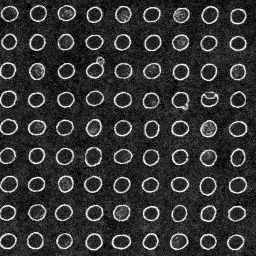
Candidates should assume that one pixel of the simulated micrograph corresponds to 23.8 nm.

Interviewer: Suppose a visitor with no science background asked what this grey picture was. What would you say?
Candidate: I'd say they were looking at a regular array of raised bodies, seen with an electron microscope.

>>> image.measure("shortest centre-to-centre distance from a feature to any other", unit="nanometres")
665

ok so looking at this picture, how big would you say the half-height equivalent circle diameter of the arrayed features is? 0.369 µm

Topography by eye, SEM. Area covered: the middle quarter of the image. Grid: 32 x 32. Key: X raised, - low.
XX----XXX----XXX-----XXX----XXX-
XX----XXXX---XXXX---XXXX----XXX-
XX----XXX----XXXX---XXXX----XXX-
--------------X-------------XX--
--------------------------------
--------------------------------
--------------------------------
XX----XXX-----XX-----XX-----XX--
XX----XXXX---XXXX---XXXX---XXXX-
XX----XXX----XXXX---XXXX---XXXX-
X------------XXX----XXX-----XXX-
--------------------------------
--------------------------------
--------------------------------
XX-----XX-----XX-----XX------X--
XX----XXX----XXXX---XXXX---XXXX-
XX----XXX----XXXX---XXX----XXXX-
X-----XX-----XXX----XXX-----XX--
--------------------------------
--------------------------------
--------------------------------
X-----XXX-----XX-----X----------
XX---XXXX----XXXX---XXXX---XXXX-
XX---XXXX----XXXX---XXXX---XXXX-
XX----XXX----XXX----XXX-----XX--
--------------------------------
--------------------------------
--------------------------------
XX-----X------X-------------XX--
XX---XXXX----XXX----XXX----XXXX-
XX---XXXX----XXX----XXX----XXXX-
X-----XX-----XXX----XXX-----XX--